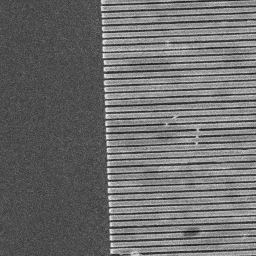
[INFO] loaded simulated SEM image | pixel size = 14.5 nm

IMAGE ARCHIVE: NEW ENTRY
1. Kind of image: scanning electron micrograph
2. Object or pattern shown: parallel lines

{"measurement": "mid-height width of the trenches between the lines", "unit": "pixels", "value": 2.37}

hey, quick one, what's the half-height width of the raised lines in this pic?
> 0.0687 µm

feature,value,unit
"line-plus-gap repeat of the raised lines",0.0977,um